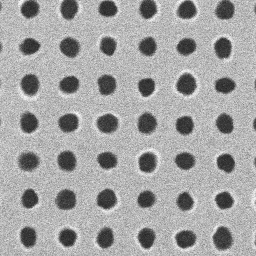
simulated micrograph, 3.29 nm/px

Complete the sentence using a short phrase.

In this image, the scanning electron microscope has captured a regular array of holes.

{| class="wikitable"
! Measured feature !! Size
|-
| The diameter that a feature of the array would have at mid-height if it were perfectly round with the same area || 0.0592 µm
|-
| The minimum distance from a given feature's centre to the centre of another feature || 122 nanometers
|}